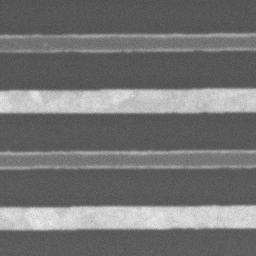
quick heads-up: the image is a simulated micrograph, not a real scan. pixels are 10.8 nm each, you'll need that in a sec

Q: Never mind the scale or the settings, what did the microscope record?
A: lines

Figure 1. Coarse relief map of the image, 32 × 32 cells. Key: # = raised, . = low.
................................
................................
................................
................................
################################
################################
................................
................................
................................
................................
................................
.###############################
################################
################################
................................
................................
................................
................................
................................
################################
################################
................................
................................
................................
................................
................................
################################
################################
######################..........
................................
................................
................................